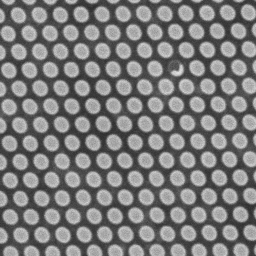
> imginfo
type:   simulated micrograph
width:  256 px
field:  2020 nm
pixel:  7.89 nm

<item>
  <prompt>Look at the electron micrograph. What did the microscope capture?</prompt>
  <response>a regular array of raised bodies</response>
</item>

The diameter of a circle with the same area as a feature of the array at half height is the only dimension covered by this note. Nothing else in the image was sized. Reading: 14.7 pixels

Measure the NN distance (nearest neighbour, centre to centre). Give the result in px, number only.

20.8